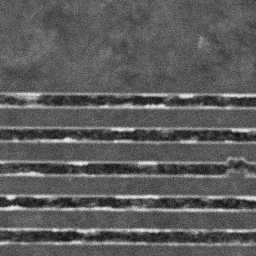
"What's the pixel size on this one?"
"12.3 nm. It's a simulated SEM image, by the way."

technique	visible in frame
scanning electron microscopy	parallel lines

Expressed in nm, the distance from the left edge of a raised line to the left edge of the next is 420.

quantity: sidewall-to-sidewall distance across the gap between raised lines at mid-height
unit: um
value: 0.248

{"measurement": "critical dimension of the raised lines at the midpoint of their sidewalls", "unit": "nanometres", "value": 173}